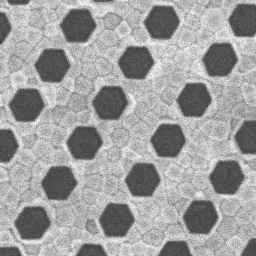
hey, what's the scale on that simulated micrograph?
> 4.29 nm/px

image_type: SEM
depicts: a regular array of holes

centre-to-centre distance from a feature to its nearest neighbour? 204 nm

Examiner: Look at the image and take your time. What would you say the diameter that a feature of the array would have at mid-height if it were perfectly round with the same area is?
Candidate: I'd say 0.144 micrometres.